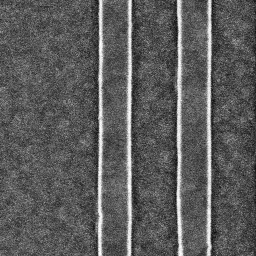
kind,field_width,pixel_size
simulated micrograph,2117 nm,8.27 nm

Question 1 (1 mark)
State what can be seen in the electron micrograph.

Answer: one or a few lines or trenches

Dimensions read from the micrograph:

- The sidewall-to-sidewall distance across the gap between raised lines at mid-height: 406 nm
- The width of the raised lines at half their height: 0.256 µm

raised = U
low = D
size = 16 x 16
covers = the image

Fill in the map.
DDDDDDUUDDDUUDDD
DDDDDDUUDDDUUDDD
DDDDDDUUDDDUUDDD
DDDDDDUUDDDUUDDD
DDDDDDUUDDDUUDDD
DDDDDDUUDDDUUDDD
DDDDDDUUDDDUUDDD
DDDDDDUUDDDUUDDD
DDDDDDUUDDDUUDDD
DDDDDDUUDDDUUDDD
DDDDDDUUDDDUUDDD
DDDDDDUUDDDUUDDD
DDDDDDUUDDDUUDDD
DDDDDDUUDDDUUDDD
DDDDDDUUDDDUUDDD
DDDDDDUUDDDUUDDD